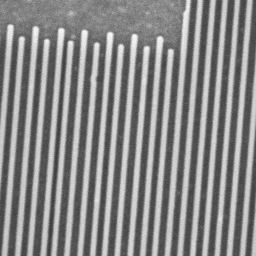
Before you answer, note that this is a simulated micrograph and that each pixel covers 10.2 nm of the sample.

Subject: parallel lines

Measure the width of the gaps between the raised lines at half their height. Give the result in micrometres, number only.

0.0867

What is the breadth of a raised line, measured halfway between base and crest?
43.4 nm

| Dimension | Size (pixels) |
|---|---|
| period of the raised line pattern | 12.4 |